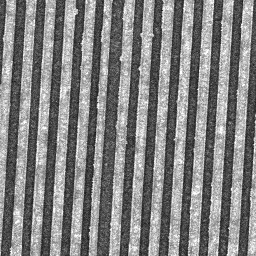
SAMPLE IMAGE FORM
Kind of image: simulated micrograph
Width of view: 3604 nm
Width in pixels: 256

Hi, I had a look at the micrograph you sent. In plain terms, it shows parallel lines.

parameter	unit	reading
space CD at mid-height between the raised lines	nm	134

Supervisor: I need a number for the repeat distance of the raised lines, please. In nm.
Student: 277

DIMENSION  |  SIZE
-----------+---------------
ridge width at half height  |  9.48 px